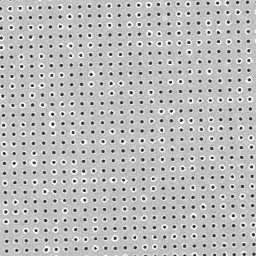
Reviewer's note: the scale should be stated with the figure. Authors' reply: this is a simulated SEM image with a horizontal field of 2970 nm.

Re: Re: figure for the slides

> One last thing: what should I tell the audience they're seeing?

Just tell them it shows a regular array of holes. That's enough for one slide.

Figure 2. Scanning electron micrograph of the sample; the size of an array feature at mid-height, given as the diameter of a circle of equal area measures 41.4 nm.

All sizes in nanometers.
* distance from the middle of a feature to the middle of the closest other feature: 110